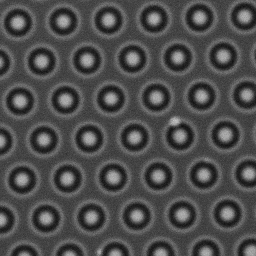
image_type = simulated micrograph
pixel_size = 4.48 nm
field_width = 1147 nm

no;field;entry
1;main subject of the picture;an array of small figures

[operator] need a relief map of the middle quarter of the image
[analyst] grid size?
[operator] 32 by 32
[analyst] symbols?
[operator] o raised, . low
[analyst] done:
oo.......ooooo......ooooo.......
ooo......oooooo.....oooooo.....o
oooo...oooooooooo.oooooooooooooo
oooooooooooooooooooooooooooooooo
oooooooooooooooooooooooooooooooo
.ooooooooo....ooooooo....ooooooo
...oooooo......ooooo......ooooo.
....oooo.......ooooo..oo...oooo.
oo..oooo...oo...ooo...oo...oooo.
oo..oooo...o...ooooo..oo...oooo.
....oooo.......ooooo......oooooo
...oooooo.....ooooooo....ooooooo
..oooooooooooooooooooooooooooooo
oooooooooooooooooooooooooooooooo
ooooooooooooooooooooooooooooo.oo
ooooo...ooooooo.....oooooo......
ooo......ooooo.......ooooo......
ooo...o...oooo...oo..oooo...oo..
oo...ooo..oooo..ooo..oooo...oo..
ooo..oo...oooo...o...oooo.......
ooo.......ooooo......ooooo......
oooo.....ooooooo....ooooooo....o
oooooooooooooooooooooooooooooooo
oooooooooooooooooooooooooooooooo
ooooooooooooooooooooooo..ooooooo
...ooooooo.....oooooo.....oooooo
....ooooo......ooooo.......oooo.
....ooooo..oo...oooo...oo..oooo.
oo...oooo..ooo..oooo...oo..oooo.
oo...oooo...o...oooo.......ooooo
....ooooo......oooooo.....oooooo
...ooooooo....oooooooo...ooooooo